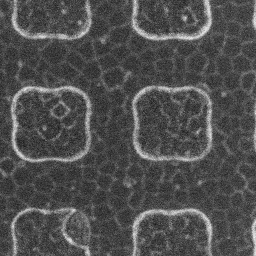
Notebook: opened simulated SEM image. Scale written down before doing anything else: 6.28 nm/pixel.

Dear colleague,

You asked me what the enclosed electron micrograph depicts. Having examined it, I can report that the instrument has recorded raised bodies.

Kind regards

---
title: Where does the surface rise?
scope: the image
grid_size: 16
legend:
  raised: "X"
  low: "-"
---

-XXXXX--XXXXX---
-XXXXX--XXXXX---
----------------
----------------
----------------
---------X------
-XXXXX--XXXXX---
-XXXXX--XXXXX---
-XXXXX--XXXXX---
-XXXX----XXXX---
----------------
----------------
----------------
-XXX-----XXXX---
-XXX----XXXXX---
-XXXX---XXXXX---